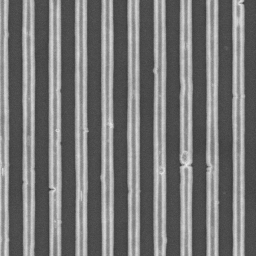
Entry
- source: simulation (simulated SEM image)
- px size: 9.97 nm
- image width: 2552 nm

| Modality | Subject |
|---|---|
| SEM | parallel lines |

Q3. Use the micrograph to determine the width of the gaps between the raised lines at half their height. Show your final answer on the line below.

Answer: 168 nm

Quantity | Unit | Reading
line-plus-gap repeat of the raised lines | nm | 261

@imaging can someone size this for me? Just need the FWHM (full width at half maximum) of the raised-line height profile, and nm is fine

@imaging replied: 88.5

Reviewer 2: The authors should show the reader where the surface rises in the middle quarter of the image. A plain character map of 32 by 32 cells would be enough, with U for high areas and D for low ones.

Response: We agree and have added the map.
DDDUUDDDDDUUDDDDUUDDDDDUUDDDDUUU
DDDUUDDDDDUUDDDDUUDDDDDUUDDDDUUU
DDDUUDDDDDUUDDDDUUDDDDDUUDDDDUUU
DDDUUDDDDDUUDDDDUUDDDDDUUDDDDUUU
DDDUUDDDDDUUDDDDUUDDDDDUUDDDDUUU
DDDUUDDDDDUUDDDDUUDDDDDUUDDDDDUU
DDDUUDDDDDUUDDDDUUDDDDDUUDDDDDUU
DDDUUDDDDDUUDDDDUUDDDDDUUDDDDUUU
DDDUUDDDDDUUDDDDUUDDDDDUUDDDDUUU
DDDUUDDDDDUUDDDDUUDDDDDUUDDDDUUU
DDDUUDDDDDUUDDDDUUDDDDDUUDDDDUUU
DDDUUDDDDDUUDDDDUUDDDDDUUDDDDUUU
DDDUUDDDDDUUDDDDUUDDDDDUUDDDDUUU
DDDUUDDDDDUUDDDDUUDDDDDUUDDDDUUU
DDDUUDDDDDUUDDDDUUDDDDDUUDDDDUUU
DDDUUDDDDDUUDDDDUUDDDDDUUDDDDUUU
DDDUUUDDDDUUDDDDUUDDDDDUUDDDDUUU
DDDUUDDDDDUUDDDDUUDDDDDUUDDDDUUU
DDDUUDDDDDUUDDDDUUDDDDDUUDDDDUUU
DDDUUDDDDDUUDDDDUUDDDDDUUDDDDUUU
DDDUUDDDDDUUDDDDUUDDDDDUUDDDDUUU
DDDUUDDDDDUUDDDDUUDDDDDUUDDDDUUU
DDDUUDDDDDUUDDDDUUDDDDDUUDDDDUUU
DDDUUDDDDDUUDDDDUUDDDDDUUDDDDUUU
DDDUUDDDDDUUDDDDUUDDDDDUUDDDDUUU
DDDUUDDDDDUUDDDDUUDDDDDUUDDDDDUD
DDDUUDDDDDUUDDDDUUDDDDDUUDDDDUUU
DDDUUDDDDDUUDDDDUUDDDDDUUDDDDUUU
DDDUUDDDDDUUDDDDUUDDDDDUUDDDDUUU
DDDUUDDDDDUUDDDDUUDDDDDUUDDDDUUU
DDDUUDDDDDUUDDDDUUDDDDDUUDDDDDUU
DDDUUDDDDDUUDDDDUUUDDDDUUDDDDDUD